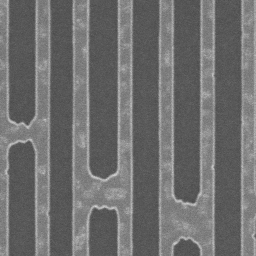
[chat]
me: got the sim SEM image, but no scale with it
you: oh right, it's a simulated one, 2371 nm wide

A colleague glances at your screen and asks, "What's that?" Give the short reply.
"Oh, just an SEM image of parallel lines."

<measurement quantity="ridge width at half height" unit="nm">123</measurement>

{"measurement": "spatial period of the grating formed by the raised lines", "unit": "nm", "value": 382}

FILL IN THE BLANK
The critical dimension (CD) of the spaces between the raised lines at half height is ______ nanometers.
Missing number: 263